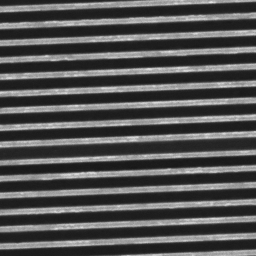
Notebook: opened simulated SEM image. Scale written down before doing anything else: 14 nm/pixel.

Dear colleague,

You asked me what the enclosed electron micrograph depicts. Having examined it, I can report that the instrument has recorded parallel lines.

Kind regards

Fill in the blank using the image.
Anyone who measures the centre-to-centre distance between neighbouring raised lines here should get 0.236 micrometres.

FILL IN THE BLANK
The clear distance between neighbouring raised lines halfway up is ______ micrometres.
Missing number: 0.133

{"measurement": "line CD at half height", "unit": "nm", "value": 108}